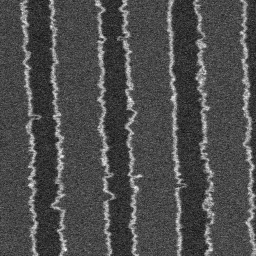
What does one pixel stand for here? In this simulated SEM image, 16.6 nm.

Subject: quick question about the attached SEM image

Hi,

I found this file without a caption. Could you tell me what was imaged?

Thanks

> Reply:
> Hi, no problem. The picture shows one or a few lines or trenches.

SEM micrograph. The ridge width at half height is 28.2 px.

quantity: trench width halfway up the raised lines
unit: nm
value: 735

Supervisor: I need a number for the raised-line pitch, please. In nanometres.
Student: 1210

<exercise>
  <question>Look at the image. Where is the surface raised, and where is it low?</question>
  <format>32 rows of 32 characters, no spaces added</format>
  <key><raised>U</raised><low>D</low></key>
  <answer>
DDDUUUDDDDDDUUUDDDDDDUUUDDDDDDDU
DDDUUUUDDDDDDUUDDDDDDUUUUDDDDDDU
DDDUUUUDDDDDUUUUDDDDDUUUUDDDDDDU
DDDUUUUDDDDDUUUDDDDDDUUUUDDDDDDU
DDDUUUUDDDDDDUUUDDDDDUUUUDDDDDUU
DDDUUUUDDDDDDUUUDDDDDUUUUDDDDDUU
DDDUUUUDDDDDDUUUDDDDDUUUUDDDDDDU
DDDUUUUDDDDDDUUUDDDDDDUUUDDDDDDU
DDDUUUUDDDDDDUUUDDDDDUUUUDDDDDDU
DDDUUUUDDDDDDUUUDDDDDDUUUDDDDDDU
DDDUUUUDDDDDDUUUDDDDDDUUUDDDDDDU
DDDDUUUDDDDDDUUUDDDDDDUUUDDDDDDU
DDDDUUUDDDDDDUUUDDDDDDUUUDDDDDDU
DDDDUUUDDDDDDUUUDDDDDDUUUUDDDDDU
DDDDUUUDDDDDDUUUUDDDDDUUUDDDDDDU
DDDDUUUDDDDDDUUUDDDDDDUUUUDDDDDU
DDDDUUUDDDDDDUUUDDDDDDUUUUDDDDDU
DDDDUUUDDDDDDUUUDDDDDDUUUUDDDDDU
DDDDUUUDDDDDDUUUDDDDDDUUUDDDDDDU
DDDDUUUDDDDDDUUUDDDDDDUUUDDDDDDU
DDDDUUUUDDDDDUUUDDDDDDUUUUDDDDDU
DDDDUUUDDDDDDDUUDDDDDDUUUUDDDDDU
DDDDUUUDDDDDDUUUUDDDDDUUUUDDDDDU
DDDDUUUUDDDDDUUUUDDDDDUUUUDDDDDU
DDDDUUUDDDDDDDUUUDDDDDUUUUDDDDDU
DDDDUUUDDDDDDUUUUDDDDDUUUUDDDDDD
DDDDUUUUDDDDDUUUUDDDDDUUUUDDDDDU
DDDDUUUUDDDDDUUUUDDDDDUUUUDDDDDU
DDDDUUUUDDDDDUUUDDDDDDUUUUDDDDDU
DDDDUUUUDDDDDDUUUDDDDDUUUUDDDDDD
DDDDUUUUDDDDDDUUUDDDDDUUUUDDDDDD
DDDDUUUUDDDDDDUUUDDDDDUUUUDDDDDD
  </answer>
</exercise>